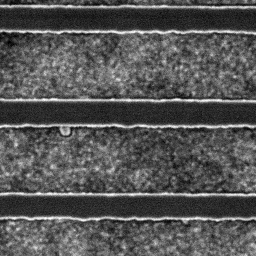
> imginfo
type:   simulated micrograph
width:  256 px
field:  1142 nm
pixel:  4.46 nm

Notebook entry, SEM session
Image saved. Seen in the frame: lines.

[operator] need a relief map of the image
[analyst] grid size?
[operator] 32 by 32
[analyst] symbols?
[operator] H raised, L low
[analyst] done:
LLLLLLLLLLLLLLLLLLLLLLLLLLLLLLLL
HHHHHHHHHHHHHHHHHHHHHHHHHHHHHHHH
HHHHHHHHHHHHHHHHHHHHHHHHHHHHHHHH
HHHHHHHHHHHHHHHHHHHHHHHHHHHHHHHH
LLLLLLLLLLLLLLLLLLLLLLLLLLLLLLLL
LLLLLLLLLLLLLLLLLLLLLLLLLLLLLLLL
LLLLLLLLLLLLLLLLLLLLLLLLLLLLLLLL
LLLLLLLLLLLLLLLLLLLLLLLLLLLLLLLL
LLLLLLLLLLLLLLLLLLLLLLLLLLLLLLLL
LLLLLLLLLLLLLLLLLLLLLLLLLLLLLLLL
LLLLLLLLLLLLLLLLLLLLLLLLLLLLLLLL
LLLLLLLLLLLLLLLLLLLLLLLLLLLLLLLL
HLHHLHHHLLHLLLLLLLLLLHHLLLLLLLLL
HHHHHHHHHHHHHHHHHHHHHHHHHHHHHHHH
HHHHHHHHHHHHHHHHHHHHHHHHHHHHHHHH
HHHHHHHHHHHHHHHHHHHHHHHHHHHHHHHH
LLLLLLLLLLLLLLLLLLLLLLLLLLLLLLLL
LLLLLLLLLLLLLLLLLLLLLLLLLLLLLLLL
LLLLLLLLLLLLLLLLLLLLLLLLLLLLLLLL
LLLLLLLLLLLLLLLLLLLLLLLLLLLLLLLL
LLLLLLLLLLLLLLLLLLLLLLLLLLLLLLLL
LLLLLLLLLLLLLLLLLLLLLLLLLLLLLLLL
LLLLLLLLLLLLLLLLLLLLLLLLLLLLLLLL
LLLLLLLLLLLLLLLLLLLLLLLLLLLLLLLL
HHHHHHHHHHHHHHHHHHHHHHHHHHHHHHHH
HHHHHHHHHHHHHHHHHHHHHHHHHHHHHHHH
HHHHHHHHHHHHHHHHHHHHHHHHHHHHHHHH
LLLLLLLLLLHLLLLLLLLLLLLLLLLHLLLL
LLLLLLLLLLLLLLLLLLLLLLLLLLLLLLLL
LLLLLLLLLLLLLLLLLLLLLLLLLLLLLLLL
LLLLLLLLLLLLLLLLLLLLLLLLLLLLLLLL
LLLLLLLLLLLLLLLLLLLLLLLLLLLLLLLL